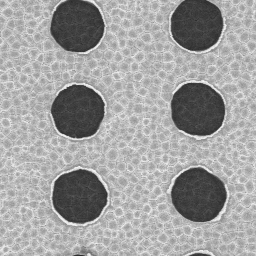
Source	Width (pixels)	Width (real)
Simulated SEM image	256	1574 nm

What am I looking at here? holes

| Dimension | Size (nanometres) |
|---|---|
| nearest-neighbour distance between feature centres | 525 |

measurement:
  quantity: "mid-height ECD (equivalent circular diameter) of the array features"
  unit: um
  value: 0.333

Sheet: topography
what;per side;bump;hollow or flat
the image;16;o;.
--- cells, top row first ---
oooo..ooooo...oo
ooo...ooooo...oo
ooo...ooooo...oo
oooooooooooooooo
oooooooooooooooo
oooo..ooooo..ooo
ooo...ooooo...oo
ooo...ooooo...oo
oooo..oooooooooo
oooooooooooooooo
oooooooooooooooo
ooo...ooooo...oo
ooo....oooo...oo
oooo..ooooo..ooo
oooooooooooooooo
oooooooooooooooo